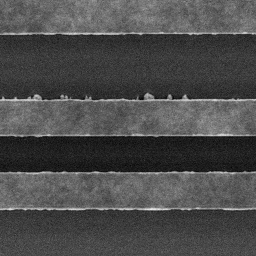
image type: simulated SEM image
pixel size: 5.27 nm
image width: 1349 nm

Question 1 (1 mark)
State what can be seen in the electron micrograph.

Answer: lines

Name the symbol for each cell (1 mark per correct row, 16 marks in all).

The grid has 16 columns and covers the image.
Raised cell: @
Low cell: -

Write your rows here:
@@@@@@@@@@@@@@@@
@@@@@@@@@@@@@@@@
----------------
----------------
----------------
----------------
@@@@@@@@@@@@@@@@
@@@@@@@@@@@@@@@@
-@--------------
----------------
----------------
@@@@@@@@@@@@@@@@
@@@@@@@@@@@@@@@@
----------------
----------------
----------------